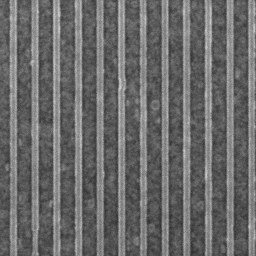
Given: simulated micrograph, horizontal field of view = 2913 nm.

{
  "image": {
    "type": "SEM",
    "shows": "parallel lines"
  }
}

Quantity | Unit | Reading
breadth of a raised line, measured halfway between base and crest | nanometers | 59.8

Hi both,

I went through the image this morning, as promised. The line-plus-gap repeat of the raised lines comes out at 0.247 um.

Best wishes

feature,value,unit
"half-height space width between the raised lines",185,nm